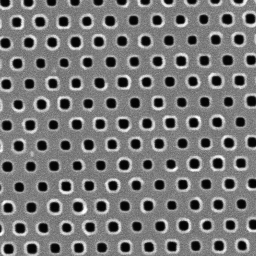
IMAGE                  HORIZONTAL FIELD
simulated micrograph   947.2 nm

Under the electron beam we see a regular array of holes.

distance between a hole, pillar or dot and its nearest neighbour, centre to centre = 85.6 nm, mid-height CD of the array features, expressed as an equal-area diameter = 9.95 pixels